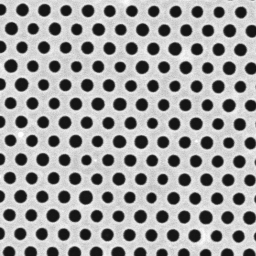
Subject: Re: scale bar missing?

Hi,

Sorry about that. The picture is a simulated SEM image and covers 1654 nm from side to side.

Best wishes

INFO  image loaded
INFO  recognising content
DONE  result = a regular array of holes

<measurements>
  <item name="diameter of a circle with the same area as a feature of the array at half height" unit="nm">81.8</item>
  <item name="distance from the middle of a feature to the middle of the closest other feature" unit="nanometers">138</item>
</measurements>